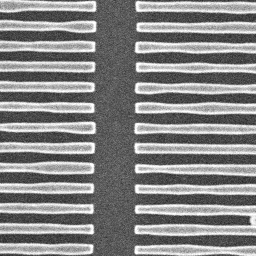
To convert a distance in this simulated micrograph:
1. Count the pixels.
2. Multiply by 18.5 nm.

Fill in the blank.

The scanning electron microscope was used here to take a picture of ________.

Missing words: groups of lines, slits or small figures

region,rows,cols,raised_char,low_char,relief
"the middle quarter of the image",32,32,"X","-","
XXXXXXX-----------XXXXXXXXXXXXXX
XXXXXXX-----------XXXXXXXXXXXXXX
--------------------------------
--------------------------------
--------------------------------
XXXXXXX-----------XXXXXXXXXXXXXX
XXXXXXX-----------XXXXXXXXXXXXXX
--------------------------------
--------------------------------
--------------------------------
XXXXXXX-----------XXXXXXXXXXXXXX
XXXXXXX-----------XXXXXXXXXXXXXX
--------------------------------
--------------------------------
--------------------------------
XXXXXXXX----------XXXXXXXXXXXXXX
XXXXXXXX----------XXXXXXXXXXXXXX
--------------------------------
--------------------------------
--------------------------------
XXXXXXX-----------XXXXXXXXXXXXXX
XXXXXXX-----------XXXXXXXXXXXXXX
--------------------------------
--------------------------------
--------------------------------
XXXXXXX-----------XXXXX--XXXXXXX
XXXXXXX-----------XXXXXXXXXXXXXX
--------------------------------
--------------------------------
--------------------------------
XXXXXXX-----------XX------XXXXXX
XXXXXXX-----------XXXXXXXXXXXXXX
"